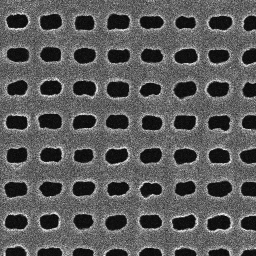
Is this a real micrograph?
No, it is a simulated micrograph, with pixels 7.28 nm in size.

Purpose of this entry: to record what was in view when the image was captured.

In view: a regular array of holes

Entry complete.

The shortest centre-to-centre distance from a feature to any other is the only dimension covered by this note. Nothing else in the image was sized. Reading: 32.9 px